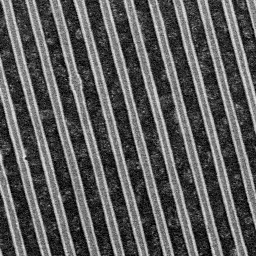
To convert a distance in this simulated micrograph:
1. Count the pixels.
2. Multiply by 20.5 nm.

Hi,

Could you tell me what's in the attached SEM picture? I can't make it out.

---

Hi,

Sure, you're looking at parallel lines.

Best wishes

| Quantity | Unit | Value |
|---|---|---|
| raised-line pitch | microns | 0.487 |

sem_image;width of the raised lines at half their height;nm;156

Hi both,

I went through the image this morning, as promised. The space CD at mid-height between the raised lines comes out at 0.313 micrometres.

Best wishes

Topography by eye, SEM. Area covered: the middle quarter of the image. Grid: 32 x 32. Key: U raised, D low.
DUUDDDDUUDDDDUUDDDDUUDDDDUUDDDDU
DUUDDDDUUDDDDUUDDDDUUDDDDDUUDDDD
DUUDDDDUUUDDDDUUDDDDUUDDDDUUDDDD
DUUUDDDDUUDDDDUUDDDDUUDDDDUUDDDD
DUUUDDDDUUDDDDUUDDDDUUDDDDUUDDDD
DDUUDDDDUUDDDDUUDDDDUUUDDDDUUDDD
DDUUDDDDUUUDDDDUUDDDDUUDDDDUUDDD
DDDUUDDDDUUDDDDUUDDDDUUDDDDUUDDD
DDDUUDDDDUUDDDDUUDDDDUUDDDDUUUDD
DDDUUDDDDUUDDDDDUDDDDDUDDDDDUUDD
DDDUUDDDDUUUDDDDUUDDDDUUDDDDUUDD
DDDDUDDDDDUUDDDDUUDDDDUUDDDDUUDD
DDDDUUDDDDUUDDDDUUDDDDUUDDDDDUUD
DDDDUUDDDDUUDDDDDUUDDDDUUDDDDUUD
DDDDUUDDDDUUUDDDDUUDDDDUUDDDDUUD
DDDDDUUDDDDUUDDDDUUDDDDUUDDDDUUD
UDDDDUUDDDDUUDDDDUUDDDDDUDDDDDUU
UDDDDUUDDDDUUDDDDUUUDDDDUUDDDDUU
UDDDDUUUDDDDUUDDDDUUDDDDUUDDDDUU
UDDDDDUUDDDDUUDDDDUUDDDDUUDDDDUU
UUDDDDUUDDDDUUDDDDUUDDDDDUDDDDUU
UUDDDDUUDDDDUUDDDDUUUDDDDUUDDDDU
UUDDDDUUUDDDDUUDDDDUUDDDDUUDDDDU
DUUDDDDUUDDDDUUDDDDUUDDDDUUDDDDU
DUUDDDDUUDDDDUUDDDDUUDDDDUUDDDDU
DUUDDDDUUDDDDUUDDDDUUUDDDDUDDDDD
DUUDDDDUUUDDDDUDDDDDUUDDDDUUDDDD
DDUUDDDDUUDDDDUUDDDDUUDDDDUUDDDD
DDUUDDDDUUDDDDUUDDDDUUDDDDUUDDDD
DDUUDDDDUUDDDDUUDDDDUUUDDDDUUDDD
DDUUDDDDUUUDDDDUUDDDDUUDDDDUUDDD
DDDUUDDDDUUDDDDUUDDDDUUDDDDUUDDD